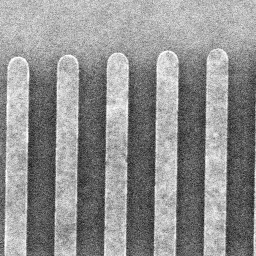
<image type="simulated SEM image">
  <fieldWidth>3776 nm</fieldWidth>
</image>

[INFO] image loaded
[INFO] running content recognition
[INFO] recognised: groups of lines, slits or small figures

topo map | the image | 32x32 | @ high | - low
--------------------------------
--------------------------------
--------------------------------
--------------------------------
--------------------------------
--------------------------------
--------------------------@@----
--@-----@@----@@----@@----@@----
-@@@---@@@---@@@----@@----@@----
-@@@---@@@---@@@----@@----@@----
-@@@---@@@---@@@----@@----@@----
-@@@---@@@---@@@----@@----@@----
-@@----@@@---@@@----@@----@@----
-@@----@@@---@@@----@@----@@----
-@@----@@@---@@@----@@----@@----
-@@----@@@---@@@----@@----@@----
-@@----@@@---@@@----@@----@@----
-@@----@@@---@@@----@@----@@----
-@@----@@@---@@@----@@----@@----
-@@----@@@---@@@----@@----@@----
-@@----@@@---@@@----@@----@@----
-@@----@@@---@@@----@@----@@----
-@@----@@@---@@@---@@@----@@----
-@@----@@@---@@@---@@@----@@----
-@@----@@@---@@@---@@@----@@----
-@@----@@@---@@@---@@@----@@----
-@@----@@----@@@---@@@----@@----
-@@----@@----@@@---@@@----@@----
-@@----@@----@@@---@@@----@@----
-@@----@@----@@@---@@@----@@----
-@@----@@----@@@---@@@----@@----
-@@----@@----@@@---@@@----@@----